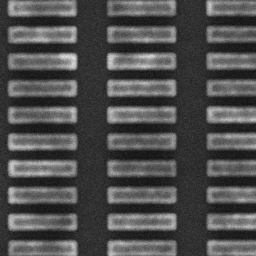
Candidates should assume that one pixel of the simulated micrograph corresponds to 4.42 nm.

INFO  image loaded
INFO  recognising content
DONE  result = groups of lines, slits or small figures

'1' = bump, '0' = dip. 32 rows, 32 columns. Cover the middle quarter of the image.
11100000000111111111111111100000
00000000000000000000000000000000
00000000000000000000000000000000
00000000000000000000000000000000
11000000000011111111111111100000
11100000000111111111111111110000
11100000000111111111111111110000
11100000000111111111111111100000
00000000000000000000000000000000
00000000000000000000000000000000
00000000000000000000000000000000
11100000000111111111111111100000
11100000000111111111111111110000
11100000000111111111111111110000
00000000000000000000000000000000
00000000000000000000000000000000
00000000000000000000000000000000
00000000000000000000000000000000
11100000000111111111111111110000
11100000000111111111111111110000
11100000000111111111111111110000
00000000000000000000000000000000
00000000000000000000000000000000
00000000000000000000000000000000
11000000000011111111111111100000
11100000000111111111111111110000
11100000000111111111111111110000
11100000000111111111111111100000
00000000000000000000000000000000
00000000000000000000000000000000
00000000000000000000000000000000
11100000000111111111111111100000